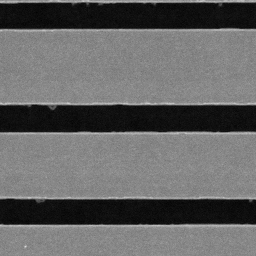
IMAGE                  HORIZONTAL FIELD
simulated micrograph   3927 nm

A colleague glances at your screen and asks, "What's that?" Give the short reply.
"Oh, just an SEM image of lines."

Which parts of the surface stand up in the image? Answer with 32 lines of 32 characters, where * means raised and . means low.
................................
................................
................................
................................
********************************
********************************
********************************
********************************
********************************
********************************
********************************
********************************
********************************
................................
................................
................................
................................
********************************
********************************
********************************
********************************
********************************
********************************
********************************
********************************
................................
................................
................................
********************************
********************************
********************************
********************************